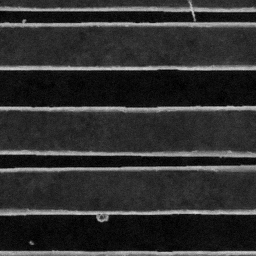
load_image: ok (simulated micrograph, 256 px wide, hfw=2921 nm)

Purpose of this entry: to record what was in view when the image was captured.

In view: lines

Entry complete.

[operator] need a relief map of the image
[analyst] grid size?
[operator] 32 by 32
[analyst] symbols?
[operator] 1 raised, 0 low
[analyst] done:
11111111111111111111111111111111
00000000000000000000000000000000
00000000000000000000000000000000
11111111111111111111111111111111
11111111111111111111111111111111
11111111111111111111111111111111
11111111111111111111111111111111
11111111111111111111111111111111
11110111111111111111001111111011
00000000000000000000000000000000
00000000000000000000000000000000
00000000000000000000000000000000
00000000000000000000000000000000
00000000000000000000000000000000
11111111111111111111111111111111
11111111111111111111111111111111
11111111111111111111111111111111
11111111111111111111111111111111
11111111111111111111111111111111
00000000000000000000000000000000
00000000000000000000000000000000
11111111111111111111111111111111
11111111111111111111111111111111
11111111111111111111111111111111
11111111111111111111111111111111
11111111111111111111111111111111
11111111111111111111111111111111
00000000000000000000000000000000
00000000000000000000000000000000
00000000000000000000000000000000
00000000000000000000000000000000
00000000000000000000000000000000